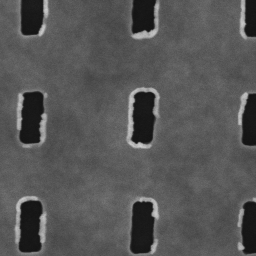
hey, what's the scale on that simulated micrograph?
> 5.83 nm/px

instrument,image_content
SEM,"holes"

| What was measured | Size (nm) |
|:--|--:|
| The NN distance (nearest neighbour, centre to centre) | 640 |